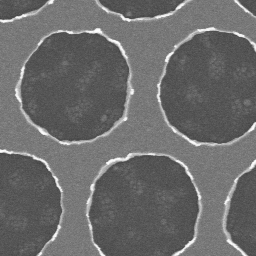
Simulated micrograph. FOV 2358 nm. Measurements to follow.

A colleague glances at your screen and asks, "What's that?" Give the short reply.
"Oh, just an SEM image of holes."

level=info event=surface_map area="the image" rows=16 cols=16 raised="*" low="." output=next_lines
..*****....****.
****************
***....*****...*
**......***.....
*.......**......
*.......**......
*.......**......
**.....***......
***...******...*
****************
...****....*****
....**......***.
....**......**..
....**......**..
...***......**..
...***.....****.